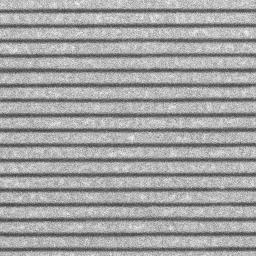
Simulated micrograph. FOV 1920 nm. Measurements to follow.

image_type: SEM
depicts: parallel lines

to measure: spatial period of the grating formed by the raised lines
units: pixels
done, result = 14.9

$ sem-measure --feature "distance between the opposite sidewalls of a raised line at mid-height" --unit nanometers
77.8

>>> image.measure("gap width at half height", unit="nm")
34.7